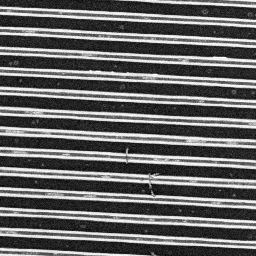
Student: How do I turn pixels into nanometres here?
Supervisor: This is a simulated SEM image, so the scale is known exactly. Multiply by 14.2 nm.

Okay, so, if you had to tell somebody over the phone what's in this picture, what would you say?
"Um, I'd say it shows parallel lines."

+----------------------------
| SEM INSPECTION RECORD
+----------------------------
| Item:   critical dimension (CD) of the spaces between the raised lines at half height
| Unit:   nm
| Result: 198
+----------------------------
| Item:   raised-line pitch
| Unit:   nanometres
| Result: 285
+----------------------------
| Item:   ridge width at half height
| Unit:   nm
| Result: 86.6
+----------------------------